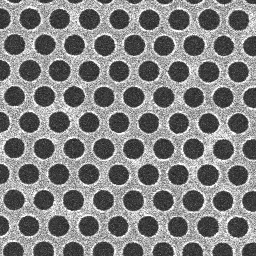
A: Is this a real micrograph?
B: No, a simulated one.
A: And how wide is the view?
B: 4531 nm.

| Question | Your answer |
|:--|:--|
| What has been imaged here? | a regular array of holes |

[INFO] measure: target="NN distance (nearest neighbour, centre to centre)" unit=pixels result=29.4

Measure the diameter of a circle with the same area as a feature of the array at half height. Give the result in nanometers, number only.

378